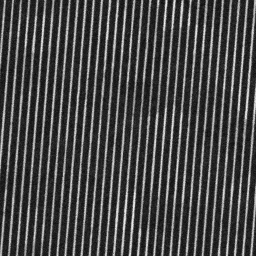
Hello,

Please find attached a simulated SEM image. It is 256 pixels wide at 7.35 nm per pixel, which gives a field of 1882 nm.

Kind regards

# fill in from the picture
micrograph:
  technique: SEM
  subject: parallel lines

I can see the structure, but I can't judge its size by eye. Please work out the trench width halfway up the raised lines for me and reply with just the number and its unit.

49.4 nm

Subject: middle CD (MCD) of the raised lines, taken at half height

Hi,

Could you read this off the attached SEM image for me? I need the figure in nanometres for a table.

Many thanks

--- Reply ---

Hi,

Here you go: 11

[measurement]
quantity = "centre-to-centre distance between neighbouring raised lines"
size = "59.2 nm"